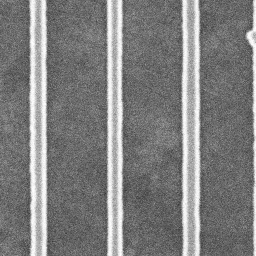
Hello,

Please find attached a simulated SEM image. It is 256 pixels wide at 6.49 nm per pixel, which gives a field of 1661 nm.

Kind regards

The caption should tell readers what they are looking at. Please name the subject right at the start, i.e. one or a few lines or trenches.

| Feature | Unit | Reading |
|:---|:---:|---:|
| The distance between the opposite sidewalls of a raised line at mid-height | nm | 77.9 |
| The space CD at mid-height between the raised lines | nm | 417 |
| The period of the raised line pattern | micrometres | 0.495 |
